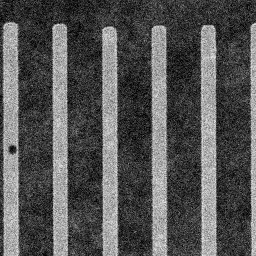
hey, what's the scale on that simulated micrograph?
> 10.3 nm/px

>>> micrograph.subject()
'parallel lines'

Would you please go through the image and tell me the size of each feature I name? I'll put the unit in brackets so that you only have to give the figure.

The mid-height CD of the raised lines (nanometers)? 140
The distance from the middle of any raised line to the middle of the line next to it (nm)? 508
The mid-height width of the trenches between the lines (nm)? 371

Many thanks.